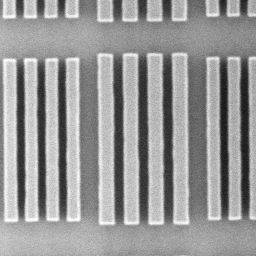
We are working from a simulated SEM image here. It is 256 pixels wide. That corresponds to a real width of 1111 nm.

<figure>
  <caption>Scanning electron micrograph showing groups of lines, slits or small figures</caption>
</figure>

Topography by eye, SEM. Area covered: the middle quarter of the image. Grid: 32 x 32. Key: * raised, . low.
.**......***...***...***...****.
.**......***...***...***...****.
.**......***...***...***...****.
.**......***...***...***...****.
.**......***...***...***...****.
.**......***...***...***...****.
.**......***...***...***...****.
.***.....***...***...***...****.
.***.....***...***...***...****.
.**......***...***...***...****.
.**......***...***...***...****.
.**......***...***...***...****.
.**......***...***...***...****.
.**......***...***...***...****.
.**......***...***...***...****.
.**......***...***...***....***.
.**......***...***...***...****.
.**......***...***...***...****.
.**......***...***...****..****.
.**......***...***...****..****.
.***.....***...***...****..****.
.***.....***...***...****..****.
.***.....***...***...****..****.
.***.....***...***...****..****.
.***.....***...***...****...***.
.***.....***...***...****...***.
.***.....***...***...****...***.
.***.....***...***...****...***.
.***.....***...***...****...***.
.***.....***...***...****...***.
.***.....***...***...****...***.
.***.....***...***...****...***.